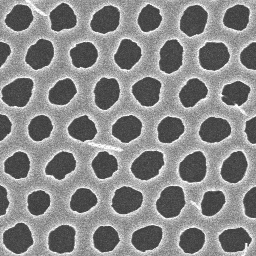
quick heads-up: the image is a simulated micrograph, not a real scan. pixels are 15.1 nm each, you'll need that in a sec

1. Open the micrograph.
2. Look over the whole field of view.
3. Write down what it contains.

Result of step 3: a regular array of holes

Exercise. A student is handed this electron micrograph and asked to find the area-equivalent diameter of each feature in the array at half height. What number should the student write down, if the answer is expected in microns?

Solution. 0.419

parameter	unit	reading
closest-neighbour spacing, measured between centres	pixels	41.3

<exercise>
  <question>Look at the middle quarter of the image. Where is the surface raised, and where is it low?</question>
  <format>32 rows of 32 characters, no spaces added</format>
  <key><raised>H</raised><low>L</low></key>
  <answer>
HHHLLLLHHHHHHHLLLHHHHHHHLLLLLHHH
HHHHHHHHHHHHHHHHHHHHHHHHLLLLLHHH
HHHHHHHHHHHHHHHHHHHHHHHHHHHHHHHH
HHHHHHHHHLLHHHHHHHHHLLLHHHHHHHHH
LLHHHHHHLLLLLLHHHHLLLLLLHHHHHHHL
LLLHHHHHLLLLLLHHHLLLLLLLHHHHHHLL
LLLHHHHLLLLLLLHHHLLLLLLLHHHHHLLL
LLLHHHHLLLLLLLHHHLLLLLLLHHHHHLLL
LLHHHHHLLLLLLLHHHHLLLLLLHHHHHLLL
LHHHHHHHLLLLLHHHHHHLLLLHHHHHHLLL
HHHHHHHHLLLLHHHHHHHHLLHHHHHHHHLL
HHHHHHHHHHLHHHHHHHHHHHHHHHHHHHHH
HHHHHHHHHHHHHHHHHHHHHHHHHHHHHHHH
HHHLLLHHHHHHHHLLLLHHHHHHHLLLLHHH
HHLLLLLHHHHHHLLLLLLHHHHHLLLLLLHH
HLLLLLLLHHHHLLLLLLLLHHHLLLLLLLHH
HLLLLLLLHHHHLLLLLLLLHHHLLLLLLLHH
HLLLLLLLHHHHLLLLLLLHHHHLLLLLLHHH
HHLLLLLLHHHHHLLLLLHHHHHLLLLLLHHH
HHHHHHHHHHHHHHLLHHHHHHHHLLLHHHHH
HHHHHHHHHHHHHHHHHHHHHHHHHHHHHHHH
HHHHHHHHHHHHHHHHHHHHHHHHHHHHHHHH
LLHHHHHHLLLLHHHHHHHLLLLLLHHHHHHH
LLLHHHHHLLLLLHHHHHLLLLLLLHHHHHLL
LLLHHHHLLLLLLHHHHLLLLLLLLHHHHLLL
LLLHHHHLLLLLLLHHHLLLLLLLLHHHHLLL
LLLHHHHLLLLLLHHHHLLLLLLLHHHHHLLL
LHHHHHHHLLLLHHHHHLLLLLLLHHHHHLLL
HHHHHHHHHLLHHHHHHHLLLLHHHHHHHLLL
HHHHHHHHHHHHHHHHHHHHHHHHHHHHHHHL
HHHHHHHHHHHHHHHHHHHHHHHHHHHLHHHH
HHHLLLLHHHHHHLLLLLHHHHHHHLLLLLHH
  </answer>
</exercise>